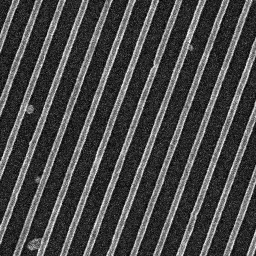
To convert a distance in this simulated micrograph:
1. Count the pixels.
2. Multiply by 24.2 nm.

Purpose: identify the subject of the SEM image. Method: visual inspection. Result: parallel lines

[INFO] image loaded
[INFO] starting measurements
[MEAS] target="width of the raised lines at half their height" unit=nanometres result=125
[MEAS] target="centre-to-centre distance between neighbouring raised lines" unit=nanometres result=532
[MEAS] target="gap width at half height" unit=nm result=399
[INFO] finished